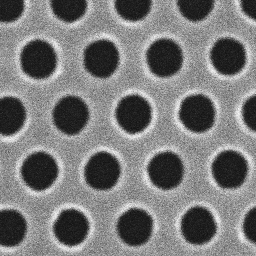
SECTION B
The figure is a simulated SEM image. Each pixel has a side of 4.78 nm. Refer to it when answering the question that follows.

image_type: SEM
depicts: a regular array of holes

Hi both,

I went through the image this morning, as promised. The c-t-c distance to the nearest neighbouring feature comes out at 303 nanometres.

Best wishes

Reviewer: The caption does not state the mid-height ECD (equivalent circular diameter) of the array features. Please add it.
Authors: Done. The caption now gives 183 nanometres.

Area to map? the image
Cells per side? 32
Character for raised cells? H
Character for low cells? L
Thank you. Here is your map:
LLLHHHLLLLLHHHLLLLLHHHLLLLLHHHLL
LLLHHHHLLLLHHHHLLLLHHHHLLLHHHHLL
LLHHHHHHLLHHHHHHLLHHHHHLLHHHHHHH
HHHHHHHHHHHHHHHHHHHHHHHHHHHHHHHH
HHHHHHHHHHHHHHHHHHHHHHHHHHHHHHHH
HHHLLLHHHHHLLLHHHHHLLLHHHHHLLLHH
HHHLLLLHHHLLLLLHHHLLLLLHHHLLLLLH
HHLLLLLHHHLLLLLHHHLLLLLHHHLLLLLH
HHHLLLLHHHHLLLLHHHHLLLLHHHHLLLHH
HHHHLLHHHHHHLLHHHHHHLHHHHHHHLHHH
HHHHHHHHHHHHHHHHHHHHHHHHHHHHHHHH
HHHHHHHHHHHHHHHHHHHHHHHHHHHHHHHH
LLHHHHHLLLHHHHHLLLHHHHHLLLHHHHHL
LLLHHHHLLLLHHHHLLLLHHHLLLLLHHHLL
LLLHHHHLLLLHHHLLLLLHHHLLLLLHHHLL
LLLHHHHLLLLHHHHLLLLHHHHLLLLHHHHL
LLHHHHHHLLHHHHHHLLHHHHHHLLHHHHHH
HHHHHHHHHHHHHHHHHHHHHHHHHHHHHHHH
HHHHHHHHHHHHHHHHHHHHHHHHHHHHHHHH
HHHHLLHHHHHLLLHHHHHLLLHHHHHLLLHH
HHHLLLLHHHHLLLLHHHHLLLLHHHHLLLLH
HHHLLLLHHHLLLLLHHHLLLLLHHHHLLLLH
HHHLLLLHHHHLLLLHHHHLLLLHHHHLLLLH
HHHHLLHHHHHHLLHHHHHHLLHHHHHHLHHH
HHHHHHHHHHHHHHHHHHHHHHHHHHHHHHHH
HHHHHHHHHHHHHHHHHHHHHHHHHHHHHHHH
LLHHHHHHLLHHHHHHLLHHHHHLLLHHHHHL
LLLHHHHLLLLHHHHLLLLHHHHLLLLHHHLL
LLLHHHHLLLLHHHHLLLLHHHHLLLLHHHLL
LLLHHHHLLLLHHHHLLLLHHHHLLLLHHHHL
LLHHHHHHLLHHHHHHLLHHHHHHLHHHHHHH
HHHHHHHHHHHHHHHHHHHHHHHHHHHHHHHH